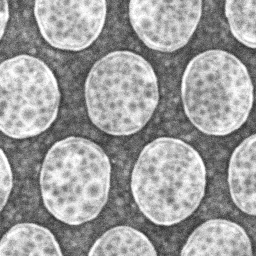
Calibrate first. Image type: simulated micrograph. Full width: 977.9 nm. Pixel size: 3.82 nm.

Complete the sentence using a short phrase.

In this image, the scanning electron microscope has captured raised bodies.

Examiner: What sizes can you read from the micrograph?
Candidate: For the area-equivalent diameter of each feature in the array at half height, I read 77.4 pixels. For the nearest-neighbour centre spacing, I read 360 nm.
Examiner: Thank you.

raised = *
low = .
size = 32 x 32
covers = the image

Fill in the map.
*...*********...*********...****
*....********...*********...****
*....********...*********....***
.....********....*******.....***
......******.....*******......**
.......****.......*****........*
...............*..........**....
.****........*****......******..
******......*******.....******..
******.....********....********.
*******....*********...********.
*******....*********...********.
*******....*********...********.
*******....********....********.
*******....********.....*******.
******......******......******..
.****........****.........***...
........***.........*..........*
.......*****......******......**
......*******.....*******....***
*....*********...********....***
*....*********...********....***
*....********...*********....***
*....********...*********....***
*....********....********....***
*.....*******....********.....**
......******......******.......*
........***........****.........
..***.........**.........*****..
.******......*****......*******.
*******.....*******....********.
*******....********....********.